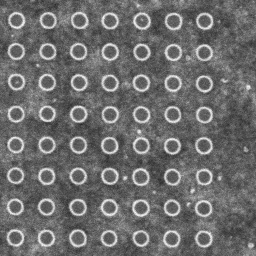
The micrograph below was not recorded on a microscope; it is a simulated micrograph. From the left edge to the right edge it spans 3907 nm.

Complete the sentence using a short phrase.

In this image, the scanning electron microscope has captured a regular array of raised bodies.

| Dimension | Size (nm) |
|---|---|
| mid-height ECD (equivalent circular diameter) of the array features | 232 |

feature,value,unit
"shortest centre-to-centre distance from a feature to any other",0.471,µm